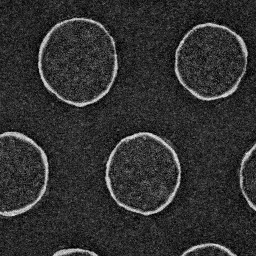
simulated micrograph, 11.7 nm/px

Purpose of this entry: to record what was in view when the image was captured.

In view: raised bodies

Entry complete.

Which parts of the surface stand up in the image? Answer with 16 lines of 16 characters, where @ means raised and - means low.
----------------
----@@----------
---@@@@----@@@@-
--@@@@@----@@@@-
---@@@@----@@@@-
---@@@@-----@@@-
----------------
----------------
@-------@@------
@@@----@@@@-----
@@@----@@@@----@
@@@----@@@@----@
@@-----@@@@----@
----------------
----------------
------------@@--